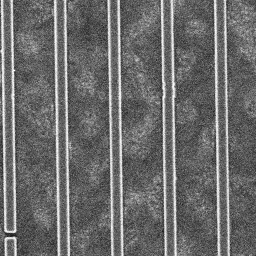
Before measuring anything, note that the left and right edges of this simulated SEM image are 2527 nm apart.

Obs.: parallel lines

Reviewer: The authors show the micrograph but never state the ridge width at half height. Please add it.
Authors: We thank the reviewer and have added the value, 0.104 µm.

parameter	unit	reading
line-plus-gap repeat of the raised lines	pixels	53.3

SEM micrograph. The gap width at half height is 421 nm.